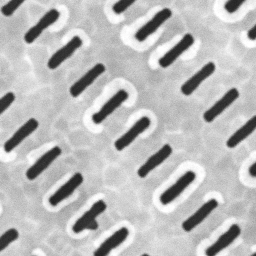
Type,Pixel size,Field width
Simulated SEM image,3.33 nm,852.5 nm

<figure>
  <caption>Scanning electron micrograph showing a regular array of holes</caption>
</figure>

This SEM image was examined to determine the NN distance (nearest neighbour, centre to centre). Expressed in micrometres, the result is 0.117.